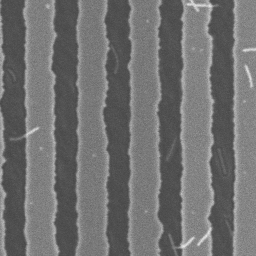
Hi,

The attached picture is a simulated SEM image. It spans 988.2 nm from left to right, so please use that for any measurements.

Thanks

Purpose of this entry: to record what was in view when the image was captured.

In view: lines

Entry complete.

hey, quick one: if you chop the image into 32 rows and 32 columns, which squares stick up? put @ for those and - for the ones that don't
---@@@@---@@@---@@@@---@@@---@@@
---@@@@---@@@---@@@@---@@@---@@@
---@@@@---@@@---@@@@---@@@---@@@
---@@@@---@@@---@@@@---@@@---@@@
---@@@@---@@@---@@@@---@@@---@@@
---@@@@---@@@@--@@@@---@@@@--@@@
---@@@@---@@@---@@@@---@@@@--@@@
@--@@@----@@@---@@@@---@@@---@@@
---@@@----@@@---@@@@---@@@---@@@
---@@@@---@@@---@@@@---@@@---@@@
---@@@@---@@@---@@@@---@@@---@@@
---@@@@---@@@---@@@@---@@@---@@@
---@@@@---@@@---@@@@---@@@@--@@@
---@@@@---@@@---@@@@---@@@@--@@@
---@@@@---@@@---@@@@---@@@@--@@@
---@@@@---@@@---@@@@---@@@---@@@
---@@@@---@@@---@@@@---@@@---@@@
---@@@@---@@@---@@@@---@@@@--@@@
@--@@@@---@@@---@@@@---@@@---@@@
---@@@@---@@@@--@@@@---@@@---@@@
---@@@@---@@@@--@@@@---@@@---@@@
---@@@@---@@@@--@@@@---@@@---@@@
---@@@@---@@@---@@@@---@@@---@@@
---@@@@--@@@@---@@@@---@@@@--@@@
@--@@@@---@@@---@@@@---@@@@--@@@
@--@@@@---@@@---@@@@---@@@@--@@@
---@@@@---@@@---@@@@---@@@---@@@
---@@@@---@@@---@@@@---@@@---@@@
@--@@@@---@@@---@@@@---@@@---@@@
@--@@@@---@@@---@@@@---@@@---@@@
@--@@@@---@@@@--@@@@---@@@---@@@
@--@@@@--@@@@---@@@@---@@@---@@@